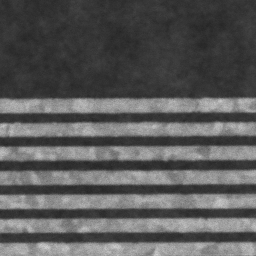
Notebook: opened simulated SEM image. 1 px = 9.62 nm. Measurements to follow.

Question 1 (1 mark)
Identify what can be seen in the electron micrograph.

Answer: parallel lines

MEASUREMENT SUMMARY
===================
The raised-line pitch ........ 0.231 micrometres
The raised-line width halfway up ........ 124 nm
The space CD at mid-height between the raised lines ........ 108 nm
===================